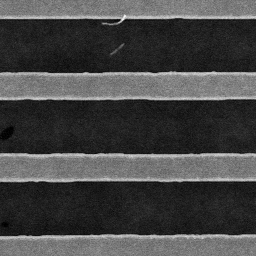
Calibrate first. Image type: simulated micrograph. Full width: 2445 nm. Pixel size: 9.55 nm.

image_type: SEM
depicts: lines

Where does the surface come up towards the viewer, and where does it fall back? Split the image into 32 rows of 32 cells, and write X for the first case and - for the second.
XXXXXXXXXXXXXXXXXXXXXXXXXXXXXXXX
XXXXXXXXXXXXXXXXXXXXXXXXXXXXXXXX
--------------------------------
--------------------------------
--------------------------------
--------------------------------
--------------------------------
--------------------------------
--------------------------------
XXXXXXXXXXXXXXXXXXXXXXXXXXXXXXXX
XXXXXXXXXXXXXXXXXXXXXXXXXXXXXXXX
XXXXXXXXXXXXXXXXXXXXXXXXXXXXXXXX
--------------------------------
--------------------------------
--------------------------------
--------------------------------
--------------------------------
--------------------------------
--------------------------------
XXXXXXXXXXXXXXXXXXXXXXXXXXXXXXXX
XXXXXXXXXXXXXXXXXXXXXXXXXXXXXXXX
XXXXXXXXXXXXXXXXXXXXXXXXXXXXXXXX
XXXXXXXXXXXXXXXXXXXXXXXXXXXXXXXX
--------------------------------
--------------------------------
--------------------------------
--------------------------------
--------------------------------
--------------------------------
---X-XX-XXXXXXXXXXXXXXXXXXXXXXXX
XXXXXXXXXXXXXXXXXXXXXXXXXXXXXXXX
XXXXXXXXXXXXXXXXXXXXXXXXXXXXXXXX